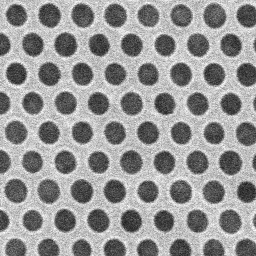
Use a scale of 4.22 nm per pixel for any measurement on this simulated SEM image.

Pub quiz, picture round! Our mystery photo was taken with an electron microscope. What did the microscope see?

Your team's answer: a regular array of holes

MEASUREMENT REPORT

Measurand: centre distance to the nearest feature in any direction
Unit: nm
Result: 139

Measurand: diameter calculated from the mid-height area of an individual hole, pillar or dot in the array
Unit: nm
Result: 102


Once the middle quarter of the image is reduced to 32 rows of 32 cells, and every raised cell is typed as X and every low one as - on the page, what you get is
XX----XXXXX----XXXX----XXXX----X
XX-----XXX------XX------XXX-----
XX------XX------XX------XX------
XX-----XXX------XX------XX------
XX-----XXXX----XXXX-----XXX-----
XXXX--XXXXXX--XXXXXX--XXXXXX---X
XXXXXXXXXXXXXXXXXXXXXXXXXXXXXXXX
--XXXXX---XXXXX----XXXXX---XXXXX
---XXX-----XXX------XXX-----XXX-
---XXX-----XXX------XX------XX--
---XXX------XX------XX------XXX-
---XXX-----XXX------XXX-----XXX-
--XXXXX---XXXXX----XXXXX---XXXXX
XXXXXXXXXXXXXXXXXXXXXXXXXXXXXXXX
XXX---XXXXX---XXXXXX--XXXXXX--XX
XX-----XXX-----XXX-----XXXX----X
XX-----XXX------XX------XX------
XX------XX------XX------XX------
XX-----XXX------XX------XXX-----
XXX---XXXXX----XXXX----XXXX----X
XXXXXXXXXXXXXXXXXXXXXXXXXXXXXXXX
-XXXXXXX-XXXXXXX-XXXXXXXXXXXXXXX
--XXXXX----XXX-----XXXX----XXXX-
---XXX-----XXX------XX------XXX-
---XXX------XX------XX------XX--
---XXX-----XXX------XX------XX--
---XXXX----XXXX----XXXX-----XXX-
-XXXXXXX--XXXXX---XXXXXX--XXXXXX
XXXXXXXXXXXXXXXXXXXXXXXXXXXXXXXX
XX----XXXXX---XXXXX----XXXX----X
XX-----XXX-----XXX-----XXX------
X------XXX------XX------XX------